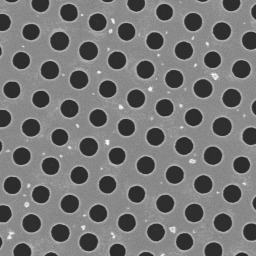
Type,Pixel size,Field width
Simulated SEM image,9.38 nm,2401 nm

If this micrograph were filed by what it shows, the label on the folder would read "a regular array of holes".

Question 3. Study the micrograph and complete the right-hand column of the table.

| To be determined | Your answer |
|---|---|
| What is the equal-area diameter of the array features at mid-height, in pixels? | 17.7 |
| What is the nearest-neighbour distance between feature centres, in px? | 30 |